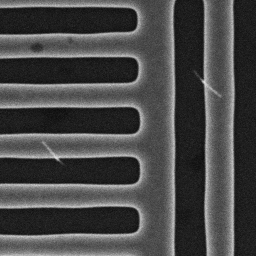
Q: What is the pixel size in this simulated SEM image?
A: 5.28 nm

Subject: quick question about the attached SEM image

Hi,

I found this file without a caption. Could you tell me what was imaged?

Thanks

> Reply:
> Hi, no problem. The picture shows groups of lines, slits or small figures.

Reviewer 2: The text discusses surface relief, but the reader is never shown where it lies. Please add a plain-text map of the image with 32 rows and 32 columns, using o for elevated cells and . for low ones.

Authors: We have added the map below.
oooooooooooooooooooooo...oooo...
.................ooooo....ooo...
.................ooooo....ooo...
.................ooooo....ooo...
oooooooooooooooooooooo....ooo...
oooooooooooooooooooooo....ooo...
oooooooooooooooooooooo....ooo...
.................ooooo....ooo...
.................ooooo....ooo...
.................ooooo...oooo...
...............ooooooo...oooo...
oooooooooooooooooooooo....ooo...
oooooooooooooooooooooo....ooo...
.................ooooo....ooo...
.................ooooo....ooo...
..................oooo....ooo...
.................ooooo....ooo...
oooooooooooooooooooooo....ooo...
oooooooooooooooooooooo....ooo...
oooooooooooooooooooooo....ooo...
.................ooooo....ooo...
..................oooo....ooo...
.................ooooo....ooo...
oooooooooooooooooooooo....ooo...
oooooooooooooooooooooo....ooo...
oooooooooooooooooooooo....ooo...
.................ooooo....ooo...
..................oooo....ooo...
.................ooooo....ooo...
o.....oooooooooooooooo....ooo...
oooooooooooooooooooooo....ooo...
oooooooooooooooooooooo....ooo...